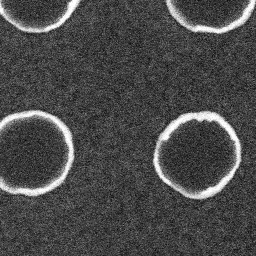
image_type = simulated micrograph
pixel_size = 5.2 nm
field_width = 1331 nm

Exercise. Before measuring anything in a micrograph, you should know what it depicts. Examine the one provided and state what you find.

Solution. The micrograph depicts raised bodies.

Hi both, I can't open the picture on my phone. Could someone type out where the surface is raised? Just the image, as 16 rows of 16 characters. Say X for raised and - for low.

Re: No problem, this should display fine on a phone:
XXXXX------XXXXX
-XXX-------XXXX-
----------------
----------------
----------------
----------------
----------------
XXXX-------XXX--
XXXX------XXXXX-
XXXXX-----XXXXX-
XXXX------XXXXX-
XXXX------XXXX--
----------------
----------------
----------------
----------------